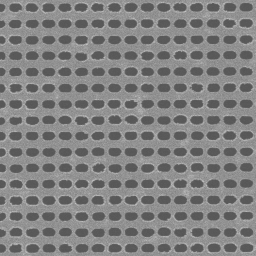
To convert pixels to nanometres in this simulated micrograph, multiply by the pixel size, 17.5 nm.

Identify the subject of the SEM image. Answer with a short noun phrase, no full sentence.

a regular array of holes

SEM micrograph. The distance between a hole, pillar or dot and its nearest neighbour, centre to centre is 277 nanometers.